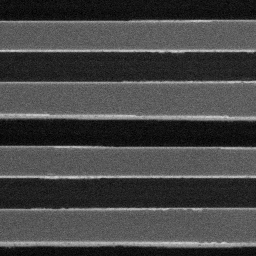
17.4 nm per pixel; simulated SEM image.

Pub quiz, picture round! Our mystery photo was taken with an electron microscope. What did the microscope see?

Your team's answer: lines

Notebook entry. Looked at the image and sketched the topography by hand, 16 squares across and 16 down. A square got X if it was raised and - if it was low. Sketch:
----------------
XXXXXXXXXXXXXXXX
XXXXXXXXXXXXXXXX
----------------
----------------
XXXXXXXXXXXXXXXX
XXXXXXXXXXXXXXXX
----------------
----------------
XXXXXXXXXXXXXXXX
XXXXXXXXXXXXXXXX
----------------
----------------
XXXXXXXXXXXXXXXX
XXXXXXXXXXXXXXXX
----------------